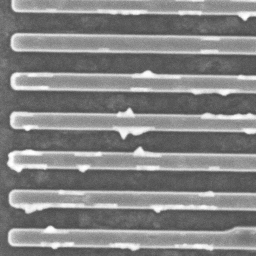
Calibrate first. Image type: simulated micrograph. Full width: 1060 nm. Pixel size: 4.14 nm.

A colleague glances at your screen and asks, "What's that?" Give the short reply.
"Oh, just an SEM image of parallel lines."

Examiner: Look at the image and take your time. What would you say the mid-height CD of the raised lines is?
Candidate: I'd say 0.0668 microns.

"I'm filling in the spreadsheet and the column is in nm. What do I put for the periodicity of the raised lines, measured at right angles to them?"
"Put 162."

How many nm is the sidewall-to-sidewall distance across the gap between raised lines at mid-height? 94.2